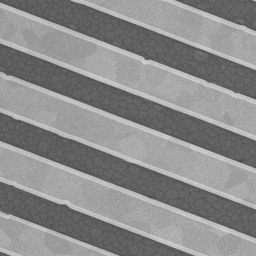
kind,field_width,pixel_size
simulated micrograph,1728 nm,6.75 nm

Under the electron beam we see one or a few lines or trenches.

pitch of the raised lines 0.437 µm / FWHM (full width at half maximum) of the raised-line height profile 33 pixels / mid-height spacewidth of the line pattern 210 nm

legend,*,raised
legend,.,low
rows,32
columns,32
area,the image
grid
...........***********..........
**............***********.......
*****...........***********.....
*******............***********..
**********...........***********
.************...........********
....***********............*****
......************...........***
.........************...........
............***********.........
***...........************......
******...........***********....
*********...........***********.
***********...........**********
..************...........*******
.....***********...........*****
.......************...........**
..........************..........
*...........************........
****...........************.....
*******...........************..
*********...........************
************...........*********
...************...........******
......***********...........****
.........***********...........*
...........***********..........
**............***********.......
*****...........************....
********...........***********..
**********...........***********
.************...........********